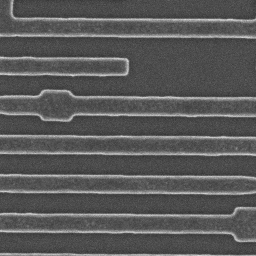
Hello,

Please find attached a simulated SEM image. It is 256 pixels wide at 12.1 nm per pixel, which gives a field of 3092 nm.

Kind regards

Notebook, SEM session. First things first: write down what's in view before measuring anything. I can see wiring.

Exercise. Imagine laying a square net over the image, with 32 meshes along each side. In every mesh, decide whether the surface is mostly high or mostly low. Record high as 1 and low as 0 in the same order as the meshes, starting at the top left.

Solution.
10000000000000000000000000000000
10000000000000000000000000000000
11111111111111111111110000000000
11111111111111111111111111111111
00000000000000000000001111111111
00000000000000000000000000000000
00000000000000000000000000000000
11111111111111110000000000000000
11111111111111110000000000000000
00000000000000000000000000000000
00000000000000000000000000000000
00000111000000000000000000000000
11111111111111111111111111111111
11111111111111111111111111111111
00000111100000000000000000000001
00000000000000000000000000000000
00000000000000000000000000000000
11111111111111111111111111111111
11111111111111111111111111111111
00000000000000000000000000000000
00000000000000000000000000000000
00000000000000000000000000000000
11111111111111111111111111111111
11111111111111111111111111111111
00000000000000000000000000000000
00000000000000000000000000000000
00000000000000000000000000000111
11111111111111111111111111111111
11111111111111111111111111111111
00000000000000000000000000000111
00000000000000000000000000000000
00000000000000000000000000000000